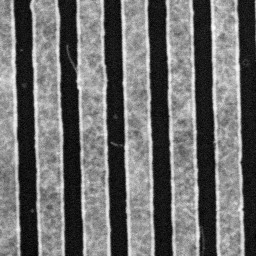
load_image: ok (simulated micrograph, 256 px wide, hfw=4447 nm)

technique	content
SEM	parallel lines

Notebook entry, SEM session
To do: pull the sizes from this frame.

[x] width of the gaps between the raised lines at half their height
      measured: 362 nanometers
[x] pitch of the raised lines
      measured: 778 nanometers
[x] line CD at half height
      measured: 23.5 px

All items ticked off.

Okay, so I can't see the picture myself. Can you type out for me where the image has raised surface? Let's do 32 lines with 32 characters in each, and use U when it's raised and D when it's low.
UUDDUUUDDDUUUDDUUUDDDUUUDDDUUDDD
UUDDUUUDDDUUUDDUUUDDDUUUDDDUUDDD
UUDDUUUDDDUUUDDUUUDDDUUUDDDUUUDD
UUDDUUUDDDUUUDDDUUDDDUUUDDDUUUDD
UUDDUUUDDDUUUDDDUUDDDUUUDDDUUUDD
UUDDUUUDDDUUUDDDUUDDDUUUDDDUUUDD
UUDDUUUDDDUUUDDDUUDDDUUUDDDUUUDD
UUDDUUUDDDUUUDDDUUDDDUUUDDDUUUDD
UUDDUUUDDDUUUDDDUUDDDUUUDDDUUUDD
UUDDUUUDDDUUUDDDUUUDDUUUDDDUUUDD
UUDDUUUDDDUUUDDDUUUDDUUUDDDUUUDD
UUDDDUUDDDUUUDDDUUUDDUUUDDDUUUDD
UUDDUUUDDDUUUDDDUUUDDUUUDDDUUUDD
UUDDUUUDDDUUUDDDUUUDDUUUDDDUUUDD
UUDDDUUDDDUUUDDDUUUDDUUUDDDUUUDD
UUDDDUUUDDUUUDDDUUUDDUUUDDDUUUDD
UUDDDUUUDDUUUDDDUUUDDUUUDDDUUUDD
UUDDDUUUDDUUUDDDUUUDDUUUDDDUUUDD
UUDDDUUUDDUUUDDDUUUDDUUUDDDUUUDD
UUDDDUUUDDUUUDDDUUUDDUUUDDDUUUDD
UUDDDUUUDDUUUDDDUUUDDDUUDDDUUUDD
UUDDDUUUDDUUUDDDUUUDDDUUDDDUUUDD
UUDDDUUUDDUUUDDDUUUDDDUUDDDUUUDD
UUDDDUUUDDUUUDDDUUUDDDUUUDDUUUDD
UUDDDUUUDDUUUDDDUUUDDDUUUDDUUUDD
UUDDDUUUDDUUUDDDUUUDDDUUUDDUUUDD
UUDDDUUUDDUUUDDDUUUDDDUUUDDUUUDD
UUDDDUUUDDDUUDDDUUUDDDUUUDDUUUDD
UUDDDUUUDDDUUUDDUUUDDDUUUDDUUUDD
UUDDDUUUDDDUUUDDUUUDDDUUUDDUUUDD
UUDDDUUUDDDUUUDDUUUDDDUUUDDUUUDD
UUDDDUUUDDDUUUDDUUUDDDUUUDDUUUDD